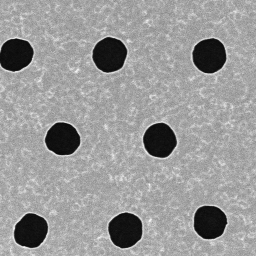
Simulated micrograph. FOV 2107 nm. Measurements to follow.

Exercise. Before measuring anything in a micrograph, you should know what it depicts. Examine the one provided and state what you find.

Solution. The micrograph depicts holes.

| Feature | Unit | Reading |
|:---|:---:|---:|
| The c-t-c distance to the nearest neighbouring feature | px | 95.6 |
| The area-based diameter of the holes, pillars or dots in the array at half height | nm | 278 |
